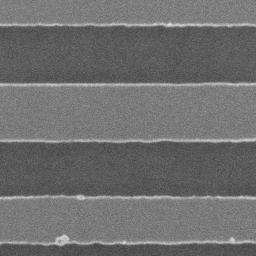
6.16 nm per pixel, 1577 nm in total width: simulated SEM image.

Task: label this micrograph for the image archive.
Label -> lines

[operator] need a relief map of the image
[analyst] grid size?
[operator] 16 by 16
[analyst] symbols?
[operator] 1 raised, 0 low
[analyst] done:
1111111111111111
1111111111111111
0000000000000000
0000000000000000
0000000000000000
1111111111111111
1111111111111111
1111111111111111
1111111111111111
0000000000000000
0000000000000000
0000000000000000
1111111111111111
1111111111111111
1111111111111111
0000000000000000